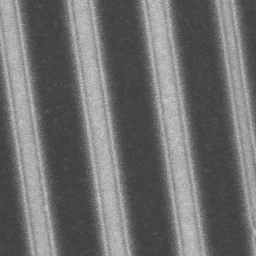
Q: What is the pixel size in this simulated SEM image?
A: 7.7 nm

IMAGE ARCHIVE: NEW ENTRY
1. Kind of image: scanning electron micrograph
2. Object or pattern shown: one or a few lines or trenches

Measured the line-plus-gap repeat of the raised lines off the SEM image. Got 0.568 um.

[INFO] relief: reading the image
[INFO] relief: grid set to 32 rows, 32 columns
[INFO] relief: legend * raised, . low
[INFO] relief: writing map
..*******..*******...******..***
..*******...******...*******.***
..*******...******...*******.***
..*******...*******..*******.***
...******...*******..*******..**
...*******..*******..*******..**
*..*******..*******...******..**
*..*******..*******...******..**
*..*******...******...*******.**
*..*******...******...*******.**
*...******...*******..*******..*
*...******...*******..*******..*
*...*******..*******...******..*
**..*******..*******...******..*
**..*******..*******...******..*
**..*******...******...*******.*
**..*******...*******..*******.*
**...******...*******..*******..
**...******...*******..*******..
**...*******..*******...******..
***..*******..*******...******..
***..*******...******...*******.
***..*******...******...*******.
***..*******...*******..*******.
***...******...*******..*******.
***...******...*******..*******.
****..*******..*******...******.
****..*******..*******...******.
****..*******...******...*******
****..*******...******...*******
****...******...*******..*******
****...******...*******..*******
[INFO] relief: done